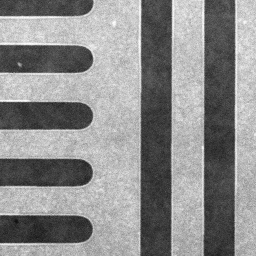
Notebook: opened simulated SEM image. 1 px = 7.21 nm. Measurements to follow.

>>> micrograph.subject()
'groups of lines, slits or small figures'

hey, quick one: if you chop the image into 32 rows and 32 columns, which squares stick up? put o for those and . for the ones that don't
............oooooo....ooo.....oo
...........ooooooo....ooo.....oo
oooooooooooooooooo....ooo.....oo
ooooooooooooooooo.....ooo.....oo
ooooooooooooooooo.....ooo.....oo
.......oooooooooo.....ooo.....oo
...........oooooo.....ooo.....oo
............oooooo....ooo.....oo
...........ooooooo....ooo.....oo
oooooooooooooooooo....ooo.....oo
oooooooooooooooooo....ooo.....oo
oooooooooooooooooo....ooo.....oo
oooooooooooooooooo....ooo.....oo
...........ooooooo....ooo.....oo
............oooooo....ooo.....oo
...........ooooooo....ooo.....oo
oooooooooooooooooo....ooo.....oo
oooooooooooooooooo....ooo.....oo
oooooooooooooooooo....ooo.....oo
oooooooooooooooooo....ooo.....oo
...........ooooooo....ooo.....oo
............oooooo....ooo.....oo
...........oooooo.....ooo.....oo
ooooooooooooooooo.....ooo.....oo
ooooooooooooooooo.....ooo.....oo
ooooooooooooooooo.....ooo.....oo
ooooooooooooooooo.....ooo....ooo
...........oooooo.....ooo....ooo
............ooooo.....ooo....ooo
...........oooooo.....ooo....ooo
.......oooooooooo.....ooo....ooo
ooooooooooooooooo.....ooo....ooo